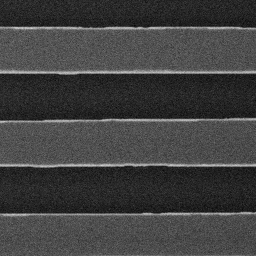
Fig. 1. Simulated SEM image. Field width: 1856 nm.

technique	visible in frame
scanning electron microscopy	lines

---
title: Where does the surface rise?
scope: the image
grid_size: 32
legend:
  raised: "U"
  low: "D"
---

DDDDDDDDDDDDDDDDDDDDDDDDDDDDDDDD
DDDDDDDDDDDDDDDDDDDDDDDDDDDDDDDD
DDDDDDDDDDDDDDDDDDDDDDDDDDDDDDDD
UUUUUUUUUUUDDUUUUUUUUUUUUUUUUUUD
UUUUUUUUUUUUUUUUUUUUUUUUUUUUUUUU
UUUUUUUUUUUUUUUUUUUUUUUUUUUUUUUU
UUUUUUUUUUUUUUUUUUUUUUUUUUUUUUUU
UUUUUUUUUUUUUUUUUUUUUUUUUUUUUUUU
UUUUUUUUUUUUUUUUUUUUUUUUUUUUUUUU
DDDDDDDDDDDDDDDDDDDDDDDDDDDDDDDD
DDDDDDDDDDDDDDDDDDDDDDDDDDDDDDDD
DDDDDDDDDDDDDDDDDDDDDDDDDDDDDDDD
DDDDDDDDDDDDDDDDDDDDDDDDDDDDDDDD
DDDDDDDDDDDDDDDDDDDDDDDDDDDDDDDD
DDDDDDDDDDDDDDDDDDDDDDDDDDDDDDDD
UUUUUUUUUUUUUUUUUUUUUUUUUUUUUUUU
UUUUUUUUUUUUUUUUUUUUUUUUUUUUUUUU
UUUUUUUUUUUUUUUUUUUUUUUUUUUUUUUU
UUUUUUUUUUUUUUUUUUUUUUUUUUUUUUUU
UUUUUUUUUUUUUUUUUUUUUUUUUUUUUUUU
UUUUUUUUUUUUUUUUUUUUUUUUUUUUUUUU
DDDDDDDDDDDDDDDDDDDDDDDDDDDDDDDD
DDDDDDDDDDDDDDDDDDDDDDDDDDDDDDDD
DDDDDDDDDDDDDDDDDDDDDDDDDDDDDDDD
DDDDDDDDDDDDDDDDDDDDDDDDDDDDDDDD
DDDDDDDDDDDDDDDDDDDDDDDDDDDDDDDD
DDDDDDDDDDDDDDDDDDDDDDDDDDDDDDDD
UUUUUUUUUUUUUUUUUUUUUUUUUUUUUUUU
UUUUUUUUUUUUUUUUUUUUUUUUUUUUUUUU
UUUUUUUUUUUUUUUUUUUUUUUUUUUUUUUU
UUUUUUUUUUUUUUUUUUUUUUUUUUUUUUUU
UUUUUUUUUUUUUUUUUUUUUUUUUUUUUUUU